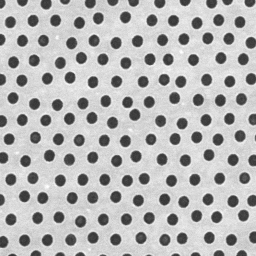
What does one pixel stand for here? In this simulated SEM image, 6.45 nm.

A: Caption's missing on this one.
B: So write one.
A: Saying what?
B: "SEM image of a regular array of holes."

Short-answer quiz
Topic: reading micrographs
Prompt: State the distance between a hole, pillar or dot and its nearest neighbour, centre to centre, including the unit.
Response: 0.131 microns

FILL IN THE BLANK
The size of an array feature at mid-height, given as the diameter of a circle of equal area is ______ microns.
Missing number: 0.078